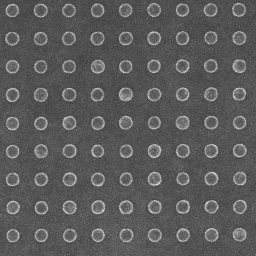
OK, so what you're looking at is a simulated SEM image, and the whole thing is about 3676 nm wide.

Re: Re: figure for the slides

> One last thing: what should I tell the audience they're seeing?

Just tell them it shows a regular array of raised bodies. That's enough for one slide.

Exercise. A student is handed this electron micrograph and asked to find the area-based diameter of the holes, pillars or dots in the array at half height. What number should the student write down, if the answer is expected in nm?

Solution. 185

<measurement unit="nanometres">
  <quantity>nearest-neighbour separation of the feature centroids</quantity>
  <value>401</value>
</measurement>